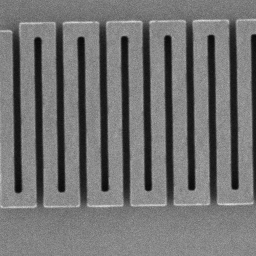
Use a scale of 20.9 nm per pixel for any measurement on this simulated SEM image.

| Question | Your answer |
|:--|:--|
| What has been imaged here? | groups of lines, slits or small figures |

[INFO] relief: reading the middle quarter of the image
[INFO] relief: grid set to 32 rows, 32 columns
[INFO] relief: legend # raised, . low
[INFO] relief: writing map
###...###..###..####..###..###..
###...###..###..####..###..###..
###...###..###..####..###..###..
###...###..###..####..###..###..
###...###..###..####..###..###..
###...###..###..####..###..####.
###...###..###..####..###..####.
###...###..###..####..###..####.
###...###..###..####..###..####.
###...###..###..####..###..####.
###...###..###..####..###..####.
###...###..###..####..###..####.
####..###..###..####..###..####.
####..###..###..####..###..####.
####..###..###..####..###..####.
####..###..###..####..###..####.
####..###..###..####..###..####.
####..###..###..####..###..####.
####..###..###..####..###..####.
####..###..####.####..###..####.
####..###..####.####..###..####.
####..###..####..###..###..####.
####..###..####..###..###..####.
####..###..####..###..###..####.
####..###..####..###..###..####.
####..###..####..###..###..####.
####..###..####..###..###..####.
####..###..####..###..###..####.
####..###..####..###..###...###.
####..###..####..###..###...###.
####..###..####..###..###...###.
####..###..####..###..###...###.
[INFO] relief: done